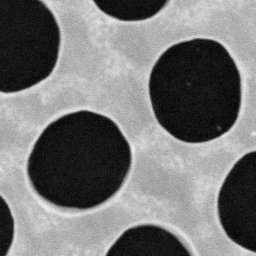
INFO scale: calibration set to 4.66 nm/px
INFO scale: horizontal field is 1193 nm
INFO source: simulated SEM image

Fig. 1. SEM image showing holes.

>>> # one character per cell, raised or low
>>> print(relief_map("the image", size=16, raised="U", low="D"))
DDDUUUDDDDUUUUUU
DDDDUUUUUUUUUUUU
DDDDUUUUUUUUDUUU
DDDDUUUUUUDDDDUU
DDDUUUUUUDDDDDDU
DDUUUUUUUDDDDDDU
UUUUUUUUUDDDDDDU
UUUUDDDUUUDDDDDU
UUDDDDDDUUUDDDUU
UUDDDDDDUUUUUUUU
UUDDDDDDUUUUUUUD
UUDDDDDDUUUUUUDD
UUUDDDDUUUUUUUDD
DUUUUUUUUUUUUUDD
DUUUUUUUDDDUUUDD
DUUUUUUDDDDDUUUD